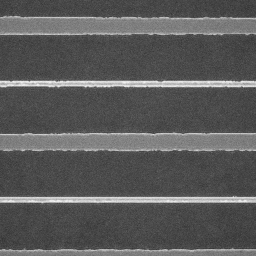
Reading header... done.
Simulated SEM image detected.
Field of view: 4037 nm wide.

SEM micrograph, lines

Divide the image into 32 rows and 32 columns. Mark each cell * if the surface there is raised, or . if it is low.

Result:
................................
................................
********************************
********************************
................................
................................
................................
................................
................................
................................
*..........*............*.**....
................................
................................
................................
................................
................................
................................
********************************
********************************
................................
................................
................................
................................
................................
................................
................................
................................
................................
................................
................................
................................
********************************